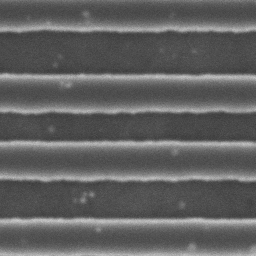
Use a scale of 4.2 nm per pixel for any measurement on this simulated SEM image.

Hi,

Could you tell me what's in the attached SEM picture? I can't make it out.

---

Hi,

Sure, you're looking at lines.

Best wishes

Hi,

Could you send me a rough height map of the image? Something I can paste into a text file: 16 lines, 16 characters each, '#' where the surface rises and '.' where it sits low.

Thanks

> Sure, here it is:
################
################
................
................
................
################
################
................
................
################
################
................
................
................
################
################